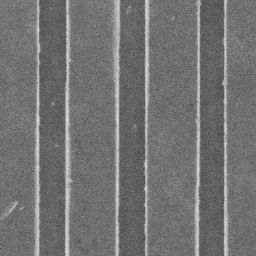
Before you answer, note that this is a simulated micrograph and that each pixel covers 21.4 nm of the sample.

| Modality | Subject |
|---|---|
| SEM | lines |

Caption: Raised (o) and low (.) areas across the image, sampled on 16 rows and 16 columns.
oo..ooo..ooo..oo
oo..ooo..ooo..oo
oo..ooo..ooo..oo
oo..ooo..ooo..oo
oo..ooo..ooo..oo
oo..ooo..ooo..oo
oo..ooo..ooo..oo
oo..ooo..ooo..oo
oo..ooo..ooo..oo
oo..ooo..ooo..oo
oo..ooo..ooo..oo
oo..ooo..ooo..oo
oo..ooo..ooo..oo
oo..ooo..ooo..oo
oo..ooo..ooo..oo
oo..ooo..ooo..oo